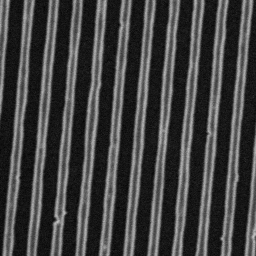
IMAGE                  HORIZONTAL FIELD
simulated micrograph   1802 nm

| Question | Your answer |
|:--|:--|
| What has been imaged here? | parallel lines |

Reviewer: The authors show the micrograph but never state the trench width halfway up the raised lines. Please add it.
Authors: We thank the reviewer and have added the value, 16.3 px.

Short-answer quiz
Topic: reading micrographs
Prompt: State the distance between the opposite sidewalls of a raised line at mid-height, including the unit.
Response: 54.4 nm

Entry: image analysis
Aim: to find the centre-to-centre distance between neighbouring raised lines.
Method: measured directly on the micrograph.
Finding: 170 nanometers